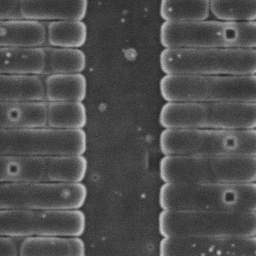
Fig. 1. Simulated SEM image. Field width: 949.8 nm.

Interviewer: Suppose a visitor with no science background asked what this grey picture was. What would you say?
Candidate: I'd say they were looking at wiring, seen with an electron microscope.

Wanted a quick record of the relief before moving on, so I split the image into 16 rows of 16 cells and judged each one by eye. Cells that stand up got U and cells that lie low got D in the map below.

UUUUUDDDDDUUUUUU
UUUUUDDDDDUUUUUU
UUUUUDDDDDUUUUUU
UUUUUDDDDDUUUUUU
UUUUUDDDDDUUUUUU
UUUUUDDDDDUUUUUU
UUUUUDDDDDUUUUUU
UUUUUDDDDDUUUUUU
UUUUUDDDDDUUUUUU
UUUUUDDDDDUUUUUU
UUUUUDDDDDUUUUUU
UUUUUDDDDDUUUUUU
UUUUUDDDDDUUUUUU
UUUUUDDDDDUUUUUU
UUUUUDDDDDUUUUUU
UUUUUDDDDDUUUUUU